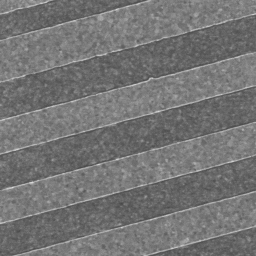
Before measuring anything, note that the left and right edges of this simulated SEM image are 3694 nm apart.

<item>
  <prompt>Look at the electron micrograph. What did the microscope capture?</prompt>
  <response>one or a few lines or trenches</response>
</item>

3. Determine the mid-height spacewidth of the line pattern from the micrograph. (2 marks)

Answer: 35.5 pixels